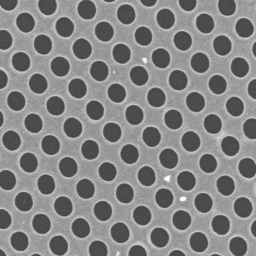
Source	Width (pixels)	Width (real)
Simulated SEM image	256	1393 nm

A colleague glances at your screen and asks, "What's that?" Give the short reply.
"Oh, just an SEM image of a regular array of holes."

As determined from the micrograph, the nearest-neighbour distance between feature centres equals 151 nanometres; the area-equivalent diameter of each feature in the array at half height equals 105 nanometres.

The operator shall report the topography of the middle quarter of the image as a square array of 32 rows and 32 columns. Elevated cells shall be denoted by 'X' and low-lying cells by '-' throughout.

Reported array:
-XXXXXX----XXXXXXX-XXXX---XXXXXX
-XXXXX-----XXXXXX----XXXXXXXXXXX
-XXXXXX----XXXXX-----XXXXXX---XX
XXXXXXX----XXXXXX----XXXXX-----X
X----XXXXXXXXXXXX----XXXXX-----X
X-----XXXXX----XXXXXXXXXXXX----X
X-----XXXXX----XXXXXX---XXXX--XX
XX----XXXXX----XXXXXX----XXXXXX-
XXX-XXXXXXX----XXXXXX----XXXXXX-
XXXXXX---XXX--XXXXXXX----XXXXX--
XXXXXX----XXXXXX---XXX--XXXXXXX-
XXXXX-----XXXXX-----XXXXXXX-XXX-
XXXXXX----XXXXX-----XXXXX----XXX
X--XXX---XXXXXXX----XXXXX-----XX
----XXXXXXXXXXXX---XXXXXX-----XX
-----XXXXX----XXXXXXXXXXXX---XXX
-----XXXXX----XXXXXX---XXXX-XXXX
----XXXXXX----XXXXXX----XXXXXX--
XXXXXXXXXX----XXXXXX----XXXXX---
XXXXX---XXX--XXXXXXX----XXXXX---
XXXX-----XXXXXX---XXX--XXXXXXX--
XXXX-----XXXXX-----XXXXXX--XXX--
XXXX-----XXXXX-----XXXXX----XXXX
--XXX---XXXXXX-----XXXXX-----XXX
---XXXXXXX-XXXX---XXXXXX----XXXX
---XXXXXX----XXXXXXX-XXXX---XXXX
---XXXXXX----XXXXXX---XXXXXXXXXX
---XXXXXX----XXXXX-----XXXXXX---
XXXXXXXXX----XXXXX-----XXXXX----
XXXX---XXXXXXXXXXXX----XXXXX----
XXX-----XXXXX----XXX-XXXXXXXX---
XXX-----XXXXX----XXXXXXX--XXXX--